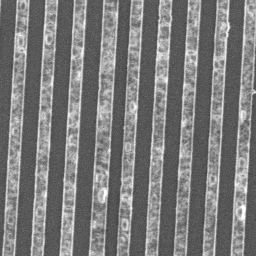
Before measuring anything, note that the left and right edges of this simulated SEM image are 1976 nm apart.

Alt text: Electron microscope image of parallel lines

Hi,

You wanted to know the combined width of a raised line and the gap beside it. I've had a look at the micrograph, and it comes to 220 nanometers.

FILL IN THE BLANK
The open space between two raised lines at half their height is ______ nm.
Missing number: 126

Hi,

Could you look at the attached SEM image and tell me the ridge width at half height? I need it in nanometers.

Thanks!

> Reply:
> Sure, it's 92.5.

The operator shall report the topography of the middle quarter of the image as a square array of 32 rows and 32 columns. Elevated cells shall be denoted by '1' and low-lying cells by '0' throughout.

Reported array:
00111000011110001110000111000011
00110000011110001110000111000011
00110000011110001110000111000011
00110000011100001110000101000011
01110000011100001110000111000011
01110000011100001110000111000011
01110000011100001110000111000011
01110000011100001100000111000011
01110000011100001100000110000011
01110000011100001100000110000011
01110000011100001100000110000011
01110000011100011100000110000011
01110000011100011100001110000011
01110000111100011100001110000111
01110000111100011100001110000111
01010000111100011100001110000111
01110000111100011100001110000111
01110000111100011100001110000111
01100000111100011100001110000111
01100000111100011100001110000111
01100000111100011100001110000111
01100000111000011100001110000111
11100000111000011100001110000111
10100000111000011100001110000111
11100000111000011100001110000111
11100000111000011000001110000111
11100000111000011000001100000111
11100000110000011000001100000010
11100000111000111000001100000110
11100000111000111000011100000110
11100000111000111000011100000110
11100001111000111000011100001110